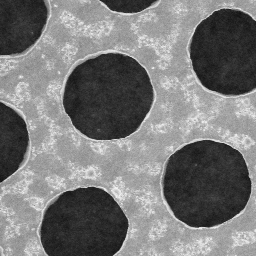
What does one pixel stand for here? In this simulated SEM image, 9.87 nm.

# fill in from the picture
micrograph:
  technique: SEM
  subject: holes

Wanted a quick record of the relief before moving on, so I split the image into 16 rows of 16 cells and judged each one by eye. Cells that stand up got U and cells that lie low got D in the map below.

DDDUUUUDDUUUUUUU
DDDUUUUUUUUUDDDD
DDUUUUUUUUUUDDDD
UUUUUUDDUUUUDDDD
UUUUDDDDDUUUDDDD
UUUUDDDDDDUUUDDD
UUUUDDDDDDUUUUUU
DUUUDDDDDUUUUUUU
DDUUUDDDUUUUUUUU
DDUUUUUUUUUDDDDU
DUUUUUUUUUDDDDDU
UUUUUUUUUUDDDDDD
UUUDDDDUUUDDDDDD
UUUDDDDDUUUDDDDU
UUDDDDDDUUUUUUUU
UUUDDDDUUUUUUUUU